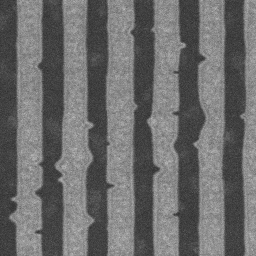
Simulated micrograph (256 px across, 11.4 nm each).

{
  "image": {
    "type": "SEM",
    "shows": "parallel lines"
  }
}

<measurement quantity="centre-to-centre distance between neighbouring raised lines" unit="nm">521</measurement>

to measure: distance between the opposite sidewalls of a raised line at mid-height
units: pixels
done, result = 22.6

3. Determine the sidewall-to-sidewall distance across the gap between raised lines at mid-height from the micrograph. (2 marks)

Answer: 256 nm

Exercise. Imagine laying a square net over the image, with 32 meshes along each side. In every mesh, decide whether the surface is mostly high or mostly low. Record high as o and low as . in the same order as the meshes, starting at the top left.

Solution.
..ooo...ooo...ooo..ooo...ooo...o
..ooo...ooo...ooo..ooo...ooo...o
..ooo...ooo...ooo..ooo...ooo...o
..ooo...ooo...ooo..ooo...ooo...o
..ooo...ooo...oo...ooo...ooo...o
..ooo...ooo...ooo..oooo..ooo...o
..ooo...ooo...oo...ooo...ooo...o
..ooo...ooo...oo...ooo....oo...o
..ooo...ooo...oo...ooo...ooo...o
..ooo...ooo...oo...ooo...ooo...o
..ooo...ooo..oooo..ooo...ooo...o
..ooo...ooo..oooo..ooo...ooo...o
..ooo...ooo..oooo..ooo...ooo...o
..ooo...ooo..oooo..ooo...ooo...o
..ooo...ooo..oooo..ooo....oo..oo
..ooo...ooo...ooo..ooo....oo...o
..ooo...ooo...ooo..ooo...ooo...o
..ooo...ooo...ooo..ooo...ooo...o
..ooo...ooo...oo...ooo...ooo...o
..ooo...ooo...oo...ooo...ooo..oo
..ooo..oooo...oo....oo...ooo..oo
..ooo...ooo...oo....oo...ooo...o
..ooo...oo....oo...ooo...ooo...o
..ooo...oo....ooo...oo...ooo...o
..oo....oo....ooo...oo...ooo...o
..ooo...ooo...ooo..ooo...ooo...o
..ooo...ooo...ooo..ooo...ooo...o
..ooo...ooo...ooo..ooo...ooo...o
..ooo...ooo...ooo..ooo...ooo...o
..ooo...ooo...ooo..ooo...ooo...o
..ooo...ooo...ooo...oo...ooo...o
..ooo...ooo...ooo...oo...ooo...o